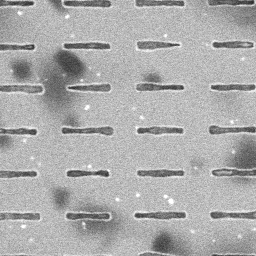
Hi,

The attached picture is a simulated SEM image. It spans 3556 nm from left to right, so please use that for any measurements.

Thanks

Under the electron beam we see a regular array of holes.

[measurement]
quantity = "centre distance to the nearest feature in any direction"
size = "588 nm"